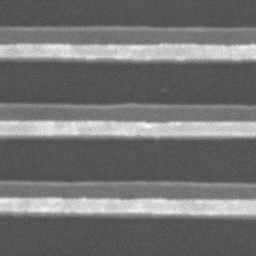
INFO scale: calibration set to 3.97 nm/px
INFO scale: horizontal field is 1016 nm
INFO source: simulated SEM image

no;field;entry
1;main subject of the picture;lines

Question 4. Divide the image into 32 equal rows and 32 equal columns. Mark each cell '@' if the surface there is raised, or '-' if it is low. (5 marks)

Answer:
--------------------------------
--------------------------------
--------------------------------
@@@@@@@@@@@@@@@@@@@-----@-------
@@@@@@@@@@@@@@@@@@@@@@@@@@@@@@@@
@@@@@@@@@@@@@@@@@@@@@@@@@@@@@@@@
@@@@@@@@@@@@@@@@@@@@@@@@@@@@@@@@
--------------------------------
--------------------------------
--------------------------------
--------------------------------
--------------------------------
--------------------------------
@@@@@@@@@@@@@@@@@@@@@@@@@@@@@@@@
@@@@@@@@@@@@@@@@@@@@@@@@@@@@@@@@
@@@@@@@@@@@@@@@@@@@@@@@@@@@@@@@@
@@@@@@@@@@@@@@@@@@@@@@@@@@@@@@@@
--------------------------------
--------------------------------
--------------------------------
--------------------------------
--------------------------------
--------------------------------
@@@@@@@@@@@@@@@@@@@@@@@@@@@@@@@@
@@@@@@@@@@@@@@@@@@@@@@@@@@@@@@@@
@@@@@@@@@@@@@@@@@@@@@@@@@@@@@@@@
----------@--@@@@@@@@@@@@@@@@@@@
--------------------------------
--------------------------------
--------------------------------
--------------------------------
--------------------------------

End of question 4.